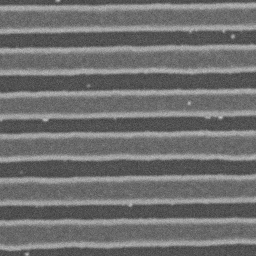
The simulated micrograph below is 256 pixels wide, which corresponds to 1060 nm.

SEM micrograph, lines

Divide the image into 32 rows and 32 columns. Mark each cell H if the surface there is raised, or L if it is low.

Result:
LLLLLLLLLLLLLLLLLLLLLLLLLLLLLLLL
HHHHHHHHHHHHHHHHHHHHHHHHHHHHHHHH
HHHHHHHHHHHHHHHHHHHHHHHHHHHHHHHH
HHHHHHHHHHHHHHHHHHHHHHHHHHHHHHLL
LLLLLLLLLLLLLLLLLLLLLLLLLLLLLLLL
LLLLLLLLLLLLLLLLLLLLLLLLLLLLLLLL
HHHHHHHHHHHHHHHHHHHHHHHHHHHHHHHH
HHHHHHHHHHHHHHHHHHHHHHHHHHHHHHHH
HHHHHHHHHHHHHHHHHHHHHHHHHHHHHHHH
LLLLLLLLLLLLLLLLLLLLLLLLLLLLLLLL
LLLLLLLLLLLLLLLLLLLLLLLLLLLLLLLL
LLLLLLLLLLLLLLLLLLHHHHHHHHHHHHHH
HHHHHHHHHHHHHHHHHHHHHHHHHHHHHHHH
HHHHHHHHHHHHHHHHHHHHHHHHHHHHHHHH
HHHHHHHHHHHHLLLLLLLLLLLLLLLLLLLL
LLLLLLLLLLLLLLLLLLLLLLLLLLLLLLLL
LLLLLLLLLLLLLLLLLLLLLLLLLLLLLLLL
HHHHHHHHHHHHHHHHHHHHHHHHHHHHHHHH
HHHHHHHHHHHHHHHHHHHHHHHHHHHHHHHH
HHHHHHHHHHHHHHHHHHHHHHHHHHHHHHHH
LLLLLLLLLLLLLLLLLLLLLLLLLLLLLLLL
LLLLLLLLLLLLLLLLLLLLLLLLLLLLLLLL
LHHHHHLHHHHHHHHHHHHHHHHHHHHHHHHH
HHHHHHHHHHHHHHHHHHHHHHHHHHHHHHHH
HHHHHHHHHHHHHHHHHHHHHHHHHHHHHHHH
LLLLLLLLLLLLLLLLLLLLLLLLLLLLLLLL
LLLLLLLLLLLLLLLLLLLLLLLLLLLLLLLL
LLLLLLLLLLLLLLLLLLLLLLLLLLLLLLLL
HHHHHHHHHHHHHHHHHHHHHHHHHHHHHHHH
HHHHHHHHHHHHHHHHHHHHHHHHHHHHHHHH
HHHHHHHHHHHHHHHHHLLLLLLLLLLLLLLL
LLLLLLLLLLLLLLLLLLLLLLLLLLLLLLLL